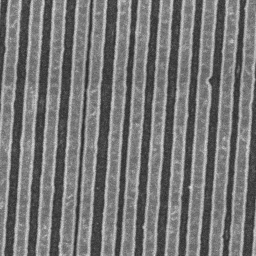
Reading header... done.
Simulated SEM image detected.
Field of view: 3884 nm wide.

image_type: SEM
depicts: parallel lines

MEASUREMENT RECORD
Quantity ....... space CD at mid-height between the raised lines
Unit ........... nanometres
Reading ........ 159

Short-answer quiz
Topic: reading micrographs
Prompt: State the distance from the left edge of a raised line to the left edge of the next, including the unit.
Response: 327 nanometers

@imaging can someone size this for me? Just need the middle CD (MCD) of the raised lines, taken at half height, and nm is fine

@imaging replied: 174